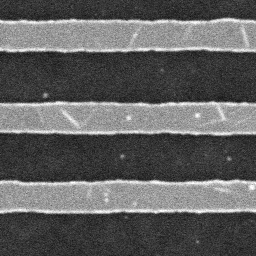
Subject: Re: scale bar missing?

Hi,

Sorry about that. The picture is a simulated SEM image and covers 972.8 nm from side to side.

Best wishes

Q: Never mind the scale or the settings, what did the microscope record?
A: lines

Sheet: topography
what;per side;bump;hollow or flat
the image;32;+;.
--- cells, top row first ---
................................
................................
........++.................+++..
++++++++++++++++++++++++++++++++
++++++++++++++++++++++++++++++++
++++++++++++++++++++++++++++++++
................................
................................
................................
................................
................................
................................
................................
++++++++++++++++++++++++++++++++
++++++++++++++++++++++++++++++++
++++++++++++++++++++++++++++++++
..+.++++++++++++++++.+++++++++++
................................
................................
................................
................................
................................
................................
++++++++++++++++++++++++++++++++
++++++++++++++++++++++++++++++++
++++++++++++++++++++++++++++++++
+....+++++++++.....+....+.......
................................
................................
................................
................................
................................